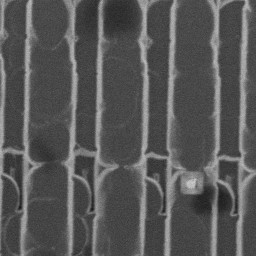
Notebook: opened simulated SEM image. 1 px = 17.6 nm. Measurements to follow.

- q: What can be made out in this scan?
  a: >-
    wiring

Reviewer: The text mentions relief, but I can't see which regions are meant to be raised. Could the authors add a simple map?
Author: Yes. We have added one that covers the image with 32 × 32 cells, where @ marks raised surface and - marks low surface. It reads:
----@@@@@----@@@@@----@@@@@----@
----@@@@@----@@@@@----@@@@@----@
----@@@@@----@@@@@----@@@@@----@
----@@@@@----@@@@@----@@@@@----@
----@@@@@----@@@@@----@@@@@----@
---@@@@@@----@@@@@----@@@@@----@
---@@@@@@----@@@@@----@@@@@---@@
---@@@@@@---@@@@@@---@@@@@@---@@
---@@@@@@---@@@@@@---@@@@@@---@@
---@@@@@@---@@@@@@---@@@@@@---@@
---@@@@@@---@@@@@@---@@@@@@---@@
---@@@@@@---@@@@@@---@@@@@@---@@
---@@@@@@---@@@@@@---@@@@@@---@@
---@@@@@@---@@@@@@---@@@@@@---@@
---@@@@@@---@@@@@@---@@@@@@---@@
---@@@@@@---@@@@@@---@@@@@@---@@
---@@@@@@---@@@@@@---@@@@@@---@@
---@@@@@@---@@@@@@---@@@@@@---@@
---@@@@@@---@@@@@@---@@@@@@---@@
---@@@@@@---@@@@@@---@@@@@@---@@
----@@@@@----@@@@@----@@@@@---@@
----@@@@@----@@@@@----@@@@-----@
---@@@@@@---@@@@@@----@--@@----@
---@@@@@@---@@@@@@---@@--@@---@@
---@@@@@@---@@@@@@---@@@@@@---@@
---@@@@@@---@@@@@@---@@@@@@---@@
---@@@@@@---@@@@@@---@@@@@@---@@
---@@@@@@---@@@@@@---@@@@@@---@@
---@@@@@@---@@@@@@---@@@@@@---@@
---@@@@@@---@@@@@@---@@@@@@---@@
---@@@@@@---@@@@@@---@@@@@@---@@
---@@@@@@---@@@@@@---@@@@@@---@@